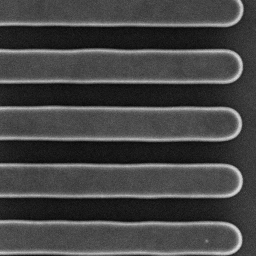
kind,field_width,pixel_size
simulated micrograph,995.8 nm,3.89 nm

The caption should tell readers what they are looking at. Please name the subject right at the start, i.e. groups of lines, slits or small figures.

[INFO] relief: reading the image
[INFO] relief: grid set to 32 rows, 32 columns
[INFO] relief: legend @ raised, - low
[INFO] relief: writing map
@@@@@@@@@@@@@@@@@@@@@@@@@@@@@@--
@@@@@@@@@@@@@@@@@@@@@@@@@@@@@@--
@@@@@@@@@@@@@@@@@@@@@@@@@@@@@@--
--------------------------------
--------------------------------
--------------------------------
@@@@@@@@@@@@@@@@@@@@@@@@@@@@@---
@@@@@@@@@@@@@@@@@@@@@@@@@@@@@@--
@@@@@@@@@@@@@@@@@@@@@@@@@@@@@@--
@@@@@@@@@@@@@@@@@@@@@@@@@@@@@@--
--------------------------------
--------------------------------
--------------------------------
@@@@@@@@@@@@@@@@@@---@@@@-------
@@@@@@@@@@@@@@@@@@@@@@@@@@@@@@--
@@@@@@@@@@@@@@@@@@@@@@@@@@@@@@--
@@@@@@@@@@@@@@@@@@@@@@@@@@@@@@--
------------------@@@@----------
--------------------------------
--------------------------------
--------------------------------
@@@@@@@@@@@@@@@@@@@@@@@@@@@@@@--
@@@@@@@@@@@@@@@@@@@@@@@@@@@@@@--
@@@@@@@@@@@@@@@@@@@@@@@@@@@@@@--
@@@@@@@@@@@@@@@@@@@@@@@@@@@@@---
--------------------------------
--------------------------------
--------------------------------
@@@@@@@@@@@@@@@@@@@@@@@@@@@@@---
@@@@@@@@@@@@@@@@@@@@@@@@@@@@@@--
@@@@@@@@@@@@@@@@@@@@@@@@@@@@@@--
@@@@@@@@@@@@@@@@@@@@@@@@@@@@@---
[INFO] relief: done